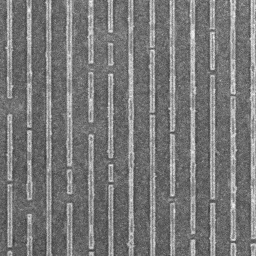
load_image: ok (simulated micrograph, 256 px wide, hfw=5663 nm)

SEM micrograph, parallel lines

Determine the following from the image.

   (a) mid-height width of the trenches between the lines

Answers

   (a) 348 nm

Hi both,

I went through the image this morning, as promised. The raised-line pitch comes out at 448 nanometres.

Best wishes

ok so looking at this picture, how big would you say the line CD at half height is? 96.8 nm